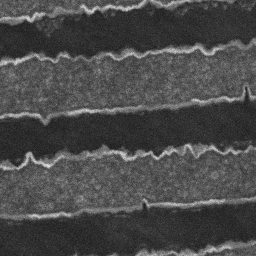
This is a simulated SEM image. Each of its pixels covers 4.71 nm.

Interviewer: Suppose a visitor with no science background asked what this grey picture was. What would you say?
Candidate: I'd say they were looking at one or a few lines or trenches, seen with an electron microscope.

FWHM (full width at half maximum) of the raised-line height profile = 267 nanometers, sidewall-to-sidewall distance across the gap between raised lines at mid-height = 42.7 pixels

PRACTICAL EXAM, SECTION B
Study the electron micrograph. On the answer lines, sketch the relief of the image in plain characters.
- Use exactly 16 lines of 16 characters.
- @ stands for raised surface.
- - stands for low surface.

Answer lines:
@@@@@@@@@-------
----------------
----------------
--@---@@@@@@@@@@
@@@@@@@@@@@@@@@@
@@@@@@@@@@@@@@@@
@@@@@@@@@@@@----
----------------
----------------
------@@--@@@@@@
@@@@@@@@@@@@@@@@
@@@@@@@@@@@@@@@@
@@@@@@@@@@@@@@@@
@@@@------------
----------------
-------------@@@